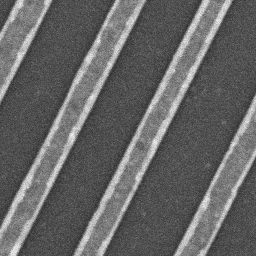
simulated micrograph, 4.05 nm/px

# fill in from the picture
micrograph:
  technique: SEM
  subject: one or a few lines or trenches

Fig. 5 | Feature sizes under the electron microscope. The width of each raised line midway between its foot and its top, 96.2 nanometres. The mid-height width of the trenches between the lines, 227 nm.